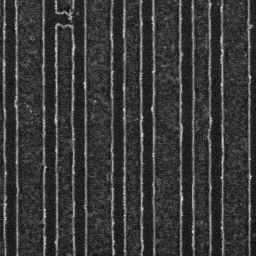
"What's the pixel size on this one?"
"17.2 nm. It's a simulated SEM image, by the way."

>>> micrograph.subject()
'parallel lines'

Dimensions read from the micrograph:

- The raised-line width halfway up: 232 nm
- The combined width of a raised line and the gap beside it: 0.589 micrometres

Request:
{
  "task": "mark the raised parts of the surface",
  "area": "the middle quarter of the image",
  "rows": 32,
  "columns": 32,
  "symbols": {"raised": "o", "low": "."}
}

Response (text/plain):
..ooo.......ooo....oooo......ooo
..ooo.......ooo....oooo......ooo
..ooo.......ooo....ooo.......ooo
..ooo.......ooo....ooo.......ooo
..ooo.......ooo....ooo.......ooo
..ooo.......ooo....ooo.......ooo
..ooo.......ooo....ooo.......ooo
..ooo.......ooo....oooo......ooo
..ooo.......ooo....ooo.......ooo
..ooo.......ooo....ooo.......ooo
..ooo.......ooo....ooo.......ooo
..ooo.......ooo....ooo.......ooo
..ooo.......ooo....ooo.......ooo
..ooo.......ooo....ooo.......ooo
..ooo.......ooo....ooo.......ooo
..ooo.......ooo....ooo.......ooo
..ooo.......ooo....ooo.......ooo
..ooo.......ooo....ooo.......ooo
..ooo.......ooo....oooo......ooo
..ooo.......ooo....ooo.......ooo
..ooo.......ooo....ooo.......ooo
..ooo.......ooo....ooo.......ooo
..ooo.......ooo....ooo.......ooo
..ooo.......ooo....ooo.......ooo
..ooo.......ooo....ooo.......ooo
..ooo.......ooo....ooo.......ooo
..ooo.......ooo....ooo.......ooo
..ooo.......ooo....ooo.......ooo
..ooo.......ooo....ooo.......ooo
..ooo.......ooo....ooo.......ooo
..ooo.......ooo....ooo.......ooo
..ooo.......ooo....ooo.......ooo